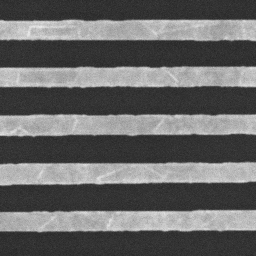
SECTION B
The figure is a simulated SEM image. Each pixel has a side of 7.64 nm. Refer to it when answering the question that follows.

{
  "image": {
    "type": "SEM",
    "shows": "lines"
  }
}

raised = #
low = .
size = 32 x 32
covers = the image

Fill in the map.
................................
................................
................................
################################
################################
................................
................................
................................
.........###..#####.############
################################
################################
................................
................................
................................
....##.####..#.#################
################################
################################
................................
................................
................................
.....................#......####
################################
################################
................................
................................
................................
....##.#########################
################################
################################
................................
................................
................................